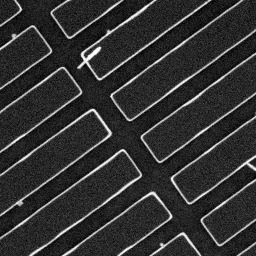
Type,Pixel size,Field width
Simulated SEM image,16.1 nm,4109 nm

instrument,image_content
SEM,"groups of lines, slits or small figures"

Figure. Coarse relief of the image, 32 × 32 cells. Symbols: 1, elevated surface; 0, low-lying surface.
11000000111111100001111111000011
11000001111110000111111100001111
10000001111100001111111000011111
00000000111000011111100001111111
00111000100001111111000011111110
01111100000011111110000111111100
11111100000111111000011111110000
11111000001111110000111111100001
11110000000111100011111110000111
11000011100010000111111100001111
10000111110000001111111000011111
00011111110000111111100001111111
00111111100000111111000011111110
01111111000000011110001111111000
11111100001100001000011111110000
11111000011110000000111111100001
11110001111111000011111110000111
11000011111110000011111100001111
10000111111100000011111000011111
00011111110000110001100001111111
00111111100001111000000011111110
01111111000011111000001111111000
11111100001111111000001111110000
11111000011111110000001111100011
11110001111111000010000110000111
11000011111110000111000000001111
10000111111100001111100000111111
00011111110000111111100001111111
00111111100001111111000000111110
11111110000111111100001000111000
11111100001111111000011100010000
11110000011111100001111110000011